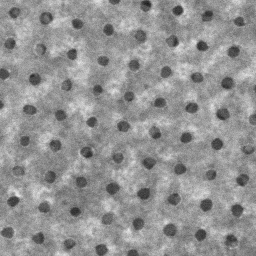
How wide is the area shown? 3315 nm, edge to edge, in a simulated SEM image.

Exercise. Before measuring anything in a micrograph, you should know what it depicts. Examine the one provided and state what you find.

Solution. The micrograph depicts a regular array of raised bodies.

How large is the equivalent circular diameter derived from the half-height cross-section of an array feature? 0.173 micrometres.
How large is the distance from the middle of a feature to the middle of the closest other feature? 0.398 micrometres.